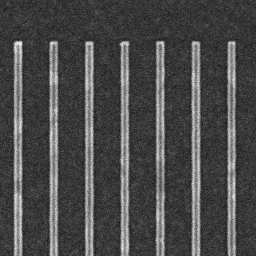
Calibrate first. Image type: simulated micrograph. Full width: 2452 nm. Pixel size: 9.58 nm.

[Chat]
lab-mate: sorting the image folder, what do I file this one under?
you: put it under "parallel lines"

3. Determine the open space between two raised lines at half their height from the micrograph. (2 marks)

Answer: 288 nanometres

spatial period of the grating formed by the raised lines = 341 nm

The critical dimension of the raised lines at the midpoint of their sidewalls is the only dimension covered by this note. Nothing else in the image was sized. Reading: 0.0563 µm